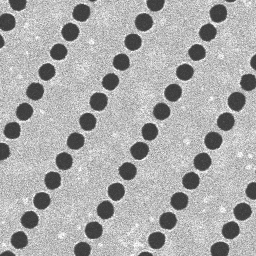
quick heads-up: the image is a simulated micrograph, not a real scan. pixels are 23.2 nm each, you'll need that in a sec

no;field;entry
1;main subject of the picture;a regular array of holes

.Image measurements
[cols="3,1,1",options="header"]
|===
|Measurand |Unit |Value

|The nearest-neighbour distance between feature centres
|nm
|525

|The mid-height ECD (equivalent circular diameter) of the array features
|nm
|410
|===